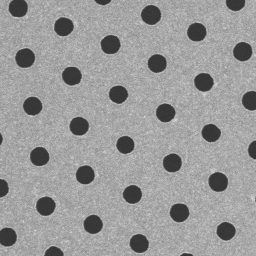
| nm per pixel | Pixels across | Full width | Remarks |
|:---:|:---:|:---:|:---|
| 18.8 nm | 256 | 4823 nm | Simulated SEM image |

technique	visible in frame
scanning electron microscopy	a regular array of holes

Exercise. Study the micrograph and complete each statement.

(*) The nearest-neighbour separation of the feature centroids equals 931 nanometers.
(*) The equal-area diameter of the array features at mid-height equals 19.6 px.